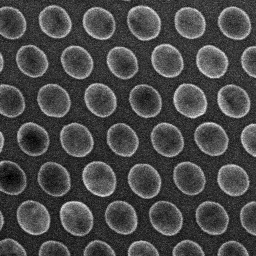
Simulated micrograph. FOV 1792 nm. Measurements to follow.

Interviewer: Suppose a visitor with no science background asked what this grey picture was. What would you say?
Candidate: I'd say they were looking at a regular array of raised bodies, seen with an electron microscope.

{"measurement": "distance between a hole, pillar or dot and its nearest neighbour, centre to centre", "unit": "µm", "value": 0.306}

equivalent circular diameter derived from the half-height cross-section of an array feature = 226 nm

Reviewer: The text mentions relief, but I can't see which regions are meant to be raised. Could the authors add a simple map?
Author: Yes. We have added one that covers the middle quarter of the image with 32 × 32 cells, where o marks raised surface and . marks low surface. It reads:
ooooooo....ooooooo....oooooooo..
ooooooo.....oooooo.....oooooo...
.ooooo.......ooooo......ooooo...
...oo.........oo................
................................
.......ooo........ooo........ooo
......oooooo.....oooooo.....oooo
o....ooooooo.....ooooooo....oooo
o....oooooooo...oooooooo....oooo
o....oooooooo....ooooooo....oooo
o.....ooooooo....ooooooo....oooo
o.....ooooooo....ooooooo....oooo
........oooo......ooooo.......oo
................................
................................
.oooo.......oooo.......oooo.....
oooooo.....oooooo.....ooooooo...
ooooooo....ooooooo....ooooooo...
ooooooo....ooooooo....oooooooo..
ooooooo....ooooooo....oooooooo..
ooooooo....ooooooo....oooooooo..
ooooooo.....oooooo.....oooooo...
.ooooo.......oooo.......oooo....
................................
................................
......ooooo.......ooo.......oooo
.....ooooooo.....oooooo.....oooo
o....ooooooo....ooooooo.....oooo
o....oooooooo...oooooooo....oooo
o....oooooooo...oooooooo....oooo
o....oooooooo....ooooooo....oooo
o.....oooooo.....ooooooo.....ooo